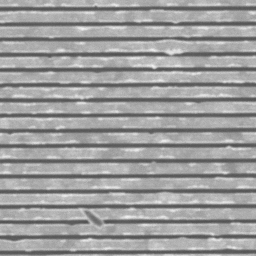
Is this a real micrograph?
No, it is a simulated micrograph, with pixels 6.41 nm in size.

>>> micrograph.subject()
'parallel lines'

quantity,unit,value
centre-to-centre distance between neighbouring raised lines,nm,97.6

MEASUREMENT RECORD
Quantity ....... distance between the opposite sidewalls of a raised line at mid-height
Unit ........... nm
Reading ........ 63.3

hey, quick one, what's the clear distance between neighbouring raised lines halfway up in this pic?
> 33.7 nanometers